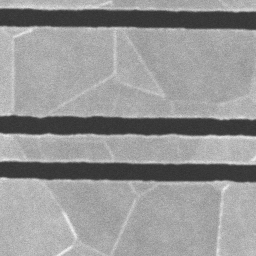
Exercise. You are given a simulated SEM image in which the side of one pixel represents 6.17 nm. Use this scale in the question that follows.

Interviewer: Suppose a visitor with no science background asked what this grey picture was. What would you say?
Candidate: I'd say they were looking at lines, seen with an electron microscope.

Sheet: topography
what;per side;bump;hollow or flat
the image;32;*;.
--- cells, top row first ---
********************************
................................
................................
******************..............
********************************
********************************
********************************
********************************
********************************
********************************
********************************
********************************
********************************
********************************
....****.***.*******************
................................
................................
********************************
********************************
********************************
....................***..*..****
................................
*****...........................
********************************
********************************
********************************
********************************
********************************
********************************
********************************
********************************
********************************